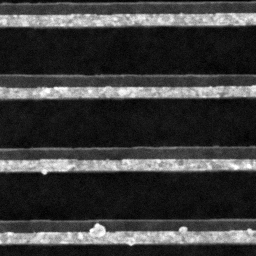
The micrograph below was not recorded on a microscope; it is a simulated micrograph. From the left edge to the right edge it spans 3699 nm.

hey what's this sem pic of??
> lines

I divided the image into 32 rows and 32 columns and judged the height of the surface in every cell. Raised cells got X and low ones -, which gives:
-------XX----XXXXXXXXXXXXXXXXXXX
XXXXXXXXXXXXXXXXXXXXXXXXXXXXXXXX
XXXXXXXXXXXXXXXXXXXXXXXXXXXXXXXX
--------------------------------
--------------------------------
--------------------------------
--------------------------------
--------------------------------
--------------------------------
XXXX-----------XX------XX--XXXXX
XXXXXXXXXXXXXXXXXXXXXXXXXXXXXXXX
XXXXXXXXXXXXXXXXXXXXXXXXXXXXXXXX
--------------------------------
--------------------------------
--------------------------------
--------------------------------
--------------------------------
--------------------------------
-----------------XX--XXXXXXXXXXX
XXXXXXXXXXXXXXXXXXXXXXXXXXXXXXXX
XXXXXXXXXXXXXXXXXXXXXXXXXXXXXXXX
-----X--------------------------
--------------------------------
--------------------------------
--------------------------------
--------------------------------
--------------------------------
----------------------------XX--
XXXXXXXXXXXXXXXXXXXXXXXXXXXXXXXX
XXXXXXXXXXXXXXXXXXXXXXXXXXXXXXXX
----------------X---------------
--------------------------------